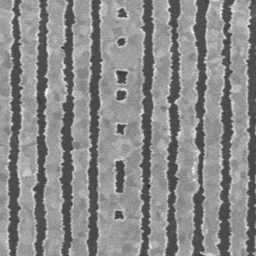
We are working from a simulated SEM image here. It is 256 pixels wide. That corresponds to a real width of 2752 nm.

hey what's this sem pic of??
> parallel lines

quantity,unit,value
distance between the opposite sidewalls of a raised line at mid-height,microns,0.183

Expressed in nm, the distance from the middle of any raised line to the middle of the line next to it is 284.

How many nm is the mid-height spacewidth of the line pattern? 105